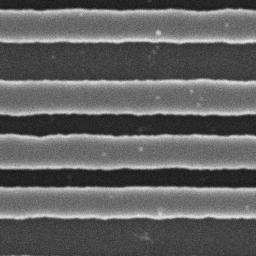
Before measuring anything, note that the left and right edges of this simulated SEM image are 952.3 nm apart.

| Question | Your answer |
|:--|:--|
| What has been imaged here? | lines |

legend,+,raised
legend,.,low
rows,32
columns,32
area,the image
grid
................................
++++++++++++++++++++++++++++++++
++++++++++++++++++++++++++++++++
++++++++++++++++++++++++++++++++
++++++++++++++++++++++++++++++++
................................
................................
................................
................................
................................
++++++++++++++++++++++++++++++++
++++++++++++++++++++++++++++++++
++++++++++++++++++++++++++++++++
++++++++++++++++++++++++++++++++
..+.............................
................................
................................
++++++++++++++++++++++++++++++++
++++++++++++++++++++++++++++++++
++++++++++++++++++++++++++++++++
++++++++++++++++++++++++++++++++
................................
................................
+.+++++.+++++..+++++++++........
++++++++++++++++++++++++++++++++
++++++++++++++++++++++++++++++++
++++++++++++++++++++++++++++++++
................................
................................
................................
................................
................................